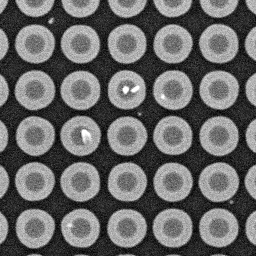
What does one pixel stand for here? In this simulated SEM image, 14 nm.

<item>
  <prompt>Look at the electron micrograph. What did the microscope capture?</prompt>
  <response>an array of small figures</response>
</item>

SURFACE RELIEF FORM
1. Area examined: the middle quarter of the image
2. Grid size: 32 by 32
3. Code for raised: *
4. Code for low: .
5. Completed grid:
................................
................................
..*****......*****.......*****..
********....*******....********.
*********..*********...*********
*********..*********...*********
*********..*********..**********
*********..*********...*********
*********..*********...*********
********....*******....********.
.******......*****.......*****..
................................
................................
..****........***........****...
.*******....*******.....*******.
********....********...********.
*********..*********...*********
*********..**********.**********
*********..**********.**********
*********..*********...*********
********....********...*********
.*******....*******.....*******.
..****........****........***...
................................
................................
.******......******.....******..
********....*******....********.
*********..*********...*********
*********..**********..*********
*********..**********..*********
*********..**********..*********
*********..*********...*********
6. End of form